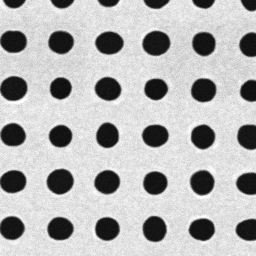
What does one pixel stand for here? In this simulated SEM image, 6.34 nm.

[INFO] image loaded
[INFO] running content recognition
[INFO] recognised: a regular array of holes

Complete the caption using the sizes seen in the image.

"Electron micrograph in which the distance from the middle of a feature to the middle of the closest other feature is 291 nm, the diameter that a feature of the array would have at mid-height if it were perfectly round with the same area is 155 nm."